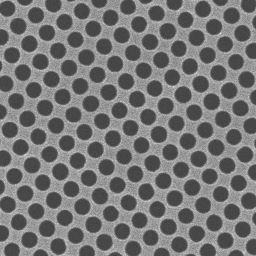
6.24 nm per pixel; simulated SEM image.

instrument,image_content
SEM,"a regular array of holes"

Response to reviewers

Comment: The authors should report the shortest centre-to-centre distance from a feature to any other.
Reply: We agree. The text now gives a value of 128 nm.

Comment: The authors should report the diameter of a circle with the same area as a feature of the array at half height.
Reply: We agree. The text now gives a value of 99.4 nanometres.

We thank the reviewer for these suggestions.